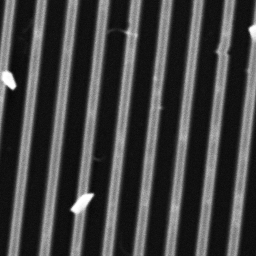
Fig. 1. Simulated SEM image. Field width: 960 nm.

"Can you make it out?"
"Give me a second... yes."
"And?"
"parallel lines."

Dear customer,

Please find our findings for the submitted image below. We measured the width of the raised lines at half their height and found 0.0391 um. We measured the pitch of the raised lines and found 117 nanometers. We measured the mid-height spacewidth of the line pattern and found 78.1 nm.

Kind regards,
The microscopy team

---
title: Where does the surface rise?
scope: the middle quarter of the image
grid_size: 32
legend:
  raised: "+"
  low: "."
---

++.....+++.....++......++.....++
++.....++......++.....+++.....++
+......++......++.....+++.....++
+......++......++.....+++.....++
+......++......++.....+++.....++
+......++.....+++.....+++.....++
+.....+++.....+++.....+++.....++
+.....+++.....+++.....+++.....++
+.....+++.....+++.....++......++
+.....+++.....++......++.....+++
+.....++......++......++.....+++
......++......++......++.....+++
......++......++.....+++.....+++
......++.....+++.....+++.....++.
......++.....+++.....+++.....++.
.....+++.....+++.....+++.....++.
.....+++.....+++.....++......++.
.....+++.....+++.....++......++.
.....+++.....++......++.....+++.
.....++......++.....+++.....+++.
.....++......++.....+++.....+++.
.....++......++.....+++.....+++.
.....++.....+++.....+++.....++..
....+++.....+++.....+++.....++..
....+++.....+++.....+++.....++..
....+++.....+++.....++......++..
....+++.....++......++......++..
....++......++......++......++..
....++......++......++......++..
....++......++......++.....+++..
....++......++.....+++.....+++..
....++.....+++.....+++.....+++..